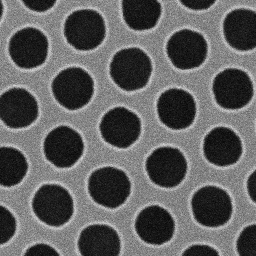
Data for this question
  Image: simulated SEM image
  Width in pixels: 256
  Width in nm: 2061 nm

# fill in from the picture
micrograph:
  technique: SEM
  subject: a regular array of holes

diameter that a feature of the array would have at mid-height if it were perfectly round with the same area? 334 nanometers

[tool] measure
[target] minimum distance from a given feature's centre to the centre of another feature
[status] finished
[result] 476 nanometers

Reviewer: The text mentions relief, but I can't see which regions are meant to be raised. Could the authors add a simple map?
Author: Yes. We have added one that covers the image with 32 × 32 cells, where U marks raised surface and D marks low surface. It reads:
UUUDDDDUUUUUUUUDDDDDUUUDDDDUUUUU
UUUUUUUUUDDDUUUDDDDDUUUUUUUUUDDD
UUUUUUUUDDDDDUUUDDDDUUUUUUUUDDDD
UUUDUUUUDDDDDUUUDDDUUUUUUUUUDDDD
UDDDDDUUDDDDDUUUUUUUUDDDDUUUDDDD
UDDDDDUUUDDDDUUUUUUUUDDDDDUUUDDD
UDDDDDUUUUUUUUUDDDUUUDDDDDUUUUUU
UUDDDDUUUUUUUUDDDDDUUDDDDDUUUUUU
UUUDUUUUUDUUUUDDDDDUUUDDUUUUUUUU
UUUUUUUDDDDUUUDDDDDUUUUUUUUDDDDU
UUUUUUDDDDDDUUDDDDUUUUUUUUUDDDDD
UDDDUUUDDDDDUUUUUUUUDDDUUUUDDDDD
DDDDDUUDDDDUUUUUUUUUDDDDUUUDDDDU
DDDDDUUUDDUUUUDDUUUUDDDDDUUUDDUU
DDDDDUUUUUUUUDDDDUUUDDDDUUUUUUUU
UDDDUUUUUUUUUDDDDDUUDDDDUUUUUUUU
UUUUUUDDDDUUUDDDDDUUUUUUUUDDDUUU
UUUUUUDDDDUUUDDDDUUUUUUUUDDDDDUU
DDUUUDDDDDUUUUUUUUUUDDUUUDDDDDUU
DDDUUUDDDDUUUUUUUUUDDDDUUUDDDDUU
DDDUUUUDDUUUUUUUUUDDDDDUUUUDDUUU
DDDUUUUUUUUUDDDDUUDDDDDUUUUUUUUU
DDDUUUUUUUUDDDDDUUUDDDDUUUUUUUUD
UUUUUDDDUUUDDDDDUUUUUUUUUDDUUUUD
UUUUDDDDDUUDDDDDUUUUUUUUDDDDDUUD
UUUUDDDDDUUUDDDUUUUUUUUUDDDDDUUU
DUUUDDDDDUUUUUUUUUDDDUUUDDDDDUUU
DDUUUDDDDUUUUUUUUDDDDDUUDDDDDUUU
DDUUUUUUUUUDDDUUUDDDDDUUUUUUUUUD
DDUUUUUUUUDDDDDUUDDDDDUUUUUUUUDD
UUUUUDUUUUDDDDDUUUUDUUUUUUUUUUDD
UUUDDDDUUUDDDDDUUUUUUUUDDDDUUUDD